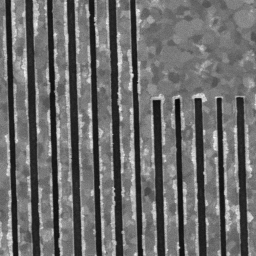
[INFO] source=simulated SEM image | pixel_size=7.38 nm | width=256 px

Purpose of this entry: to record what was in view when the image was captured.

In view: parallel lines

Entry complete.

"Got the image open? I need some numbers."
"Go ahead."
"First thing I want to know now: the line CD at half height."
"102 nm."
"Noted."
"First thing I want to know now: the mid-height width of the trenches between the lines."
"48 nanometres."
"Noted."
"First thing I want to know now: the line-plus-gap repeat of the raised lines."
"0.154 um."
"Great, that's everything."